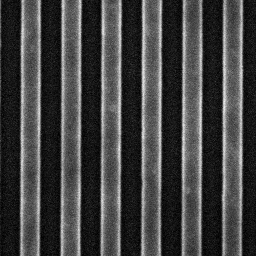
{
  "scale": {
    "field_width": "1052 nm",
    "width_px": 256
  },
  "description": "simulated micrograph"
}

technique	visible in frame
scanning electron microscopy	parallel lines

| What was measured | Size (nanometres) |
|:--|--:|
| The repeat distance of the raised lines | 166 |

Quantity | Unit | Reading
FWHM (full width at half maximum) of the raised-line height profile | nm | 74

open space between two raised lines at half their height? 90.4 nanometres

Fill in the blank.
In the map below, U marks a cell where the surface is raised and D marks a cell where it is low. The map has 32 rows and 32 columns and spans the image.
DDDUUDDDUUDDDUUDDDUUDDDUUDDDUUDD
DDDUUDDDUUDDDUUDDDUUDDDUUDDDUUDD
DDDUUDDDUUDDDUUDDDUUDDDUUDDDUUDD
DDDUUDDDUUDDDUUDDDUUDDDUUDDDUUDD
DDDUUDDDUUDDDUUDDDUUDDDUUDDDUUDD
DDDUUDDDUUDDDUUDDDUUDDDUUDDDUUDD
DDDUUDDDUUDDDUUDDDUUDDDUUDDDUUDD
DDDUUDDDUUDDDUUDDDUUDDDUUDDDUUDD
DDDUUDDDUUDDDUUDDDUUDDDUUDDDUUDD
DDDUUDDDUUDDDUUDDDUUDDDUUDDDUUDD
DDDUUDDDUUDDDUUDDDUUDDDUUDDDUUDD
DDDUUDDDUUDDDUUDDDUUDDDUUDDDUUDD
DDDUUDDDUUDDDUUDDDUUDDDUUDDDUUDD
DDDUUDDDUUDDDUUDDDUUDDDUUDDDUUDD
DDDUUDDDUUDDDUUDDDUUDDDUUDDDUUDD
DDDUUDDDUUDDDUUDDDUUDDDUUDDDUUDD
DDDUUDDDUUDDDUUDDDUUDDDUUDDDUUDD
DDDUUDDDUUDDDUUDDDUUDDDUUDDDUUDD
DDDUUDDDUUDDDUUDDDUUDDDUUDDDUUDD
DDDUUDDDUUDDDUUDDDUUDDDUUDDDUUDD
DDDUUDDDUUDDDUUDDDUUDDDUUDDDUUDD
DDDUUDDDUUDDDUUDDDUUDDDUUDDDUUDD
DDDUUDDDUUDDDUUDDDUUDDDUUDDDUUDD
DDDUUDDDUUDDDUUDDDUUDDDUUDDDUUDD
DDDUUDDDUUDDDUUDDDUUDDDUUDDDUUDD
DDDUUDDDUUDDDUUDDDUUDDDUUDDDUUDD
DDDUUDDDUUDDDUUDDDUUDDDUUDDDUUDD
DDDUUDDDUUDDDUUDDDUUDDDUUDDDUUDD
DDDUUDDDUUDDDUUDDDUUDDDUUDDDUUDD
DDDUUDDDUUDDDUUDDDUUDDDUUDDDUUDD
DDDUUDDDUUDDDUUDDDUUDDDUUDDDUUDD
DDDUUDDDUUDDDUUDDDUUDDDUUDDDUUDD